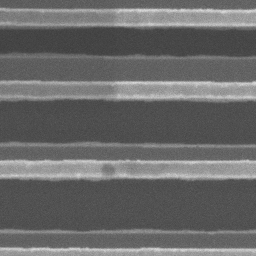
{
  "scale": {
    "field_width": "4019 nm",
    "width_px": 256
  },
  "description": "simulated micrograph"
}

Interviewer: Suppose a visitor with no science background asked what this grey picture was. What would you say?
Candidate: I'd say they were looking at lines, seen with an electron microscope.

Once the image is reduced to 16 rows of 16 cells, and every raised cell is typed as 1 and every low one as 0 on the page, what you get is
1111111111111111
1111111111111111
0000000000000000
0000000000000000
1111111111111111
1111111111111111
0000000000000000
0000000000000000
0000000000000000
1111111111111111
1111111111111111
0000000000000000
0000000000000000
0000000000000000
0000000000000000
1111111111111111